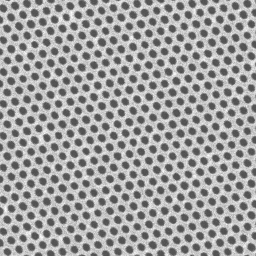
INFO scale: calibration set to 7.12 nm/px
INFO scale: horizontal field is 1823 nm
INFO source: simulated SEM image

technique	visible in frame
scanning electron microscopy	a regular array of holes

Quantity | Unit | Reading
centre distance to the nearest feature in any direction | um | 0.0841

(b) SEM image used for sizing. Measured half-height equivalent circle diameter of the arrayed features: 59.1 nm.